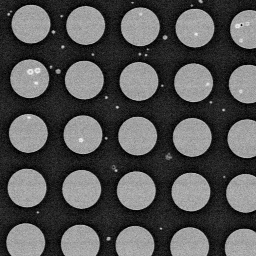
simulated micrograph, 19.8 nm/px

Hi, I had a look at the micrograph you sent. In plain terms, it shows an array of small figures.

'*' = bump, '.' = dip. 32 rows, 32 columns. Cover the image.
................................
..****...***....***....***....**
..****..*****..*****..****...***
..****..*****..*****..*****..***
..****...****..*****..*****..***
..........*......*.....***....**
................................
................................
..****...***....***....***....**
.*****..*****..*****..****...***
.*****..*****..*****..*****..***
..***....***...****...****...***
.................*.....**.....**
................................
...*............................
.*****..****...****...****...***
.*****..*****..*****..****...***
.*****..*****..*****..****...***
..***....***...****...****...***
.......................**.....**
................................
..***....**.....................
.*****..****...****...****...***
.*****..*****..****...****..****
.*****..****...****...****..****
..***....***...****...****...***
..............................*.
................................
..***....**.....**.....*........
.****...****...****...****...***
.*****..****...****..*****..****
.****...****...****..*****..****